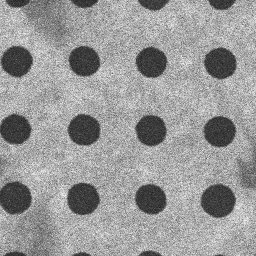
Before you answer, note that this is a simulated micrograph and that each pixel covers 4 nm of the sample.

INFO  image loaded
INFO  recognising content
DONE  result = a regular array of holes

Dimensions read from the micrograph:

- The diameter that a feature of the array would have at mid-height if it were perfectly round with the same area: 125 nanometers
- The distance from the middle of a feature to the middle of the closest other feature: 270 nm